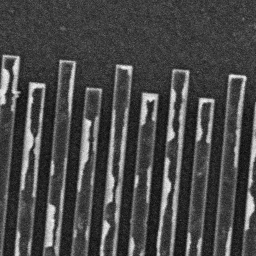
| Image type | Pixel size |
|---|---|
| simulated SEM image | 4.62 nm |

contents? parallel lines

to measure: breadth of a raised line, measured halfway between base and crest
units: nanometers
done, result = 73.6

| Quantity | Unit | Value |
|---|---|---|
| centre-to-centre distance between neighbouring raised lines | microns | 0.131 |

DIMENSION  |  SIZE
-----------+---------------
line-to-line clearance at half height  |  59.8 nm